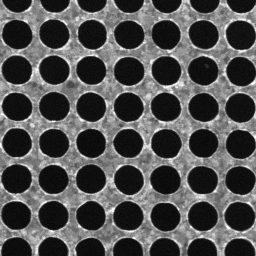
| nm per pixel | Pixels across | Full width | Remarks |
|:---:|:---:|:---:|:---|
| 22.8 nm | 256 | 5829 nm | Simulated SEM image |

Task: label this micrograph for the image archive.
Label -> a regular array of holes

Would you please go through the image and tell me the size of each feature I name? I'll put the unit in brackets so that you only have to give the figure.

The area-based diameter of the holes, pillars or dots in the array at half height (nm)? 684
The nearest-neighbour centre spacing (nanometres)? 823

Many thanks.